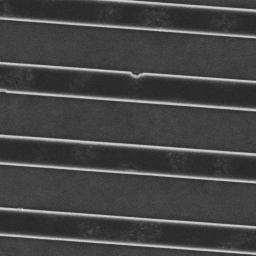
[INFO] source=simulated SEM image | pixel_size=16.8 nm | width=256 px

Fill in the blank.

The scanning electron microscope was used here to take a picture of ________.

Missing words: one or a few lines or trenches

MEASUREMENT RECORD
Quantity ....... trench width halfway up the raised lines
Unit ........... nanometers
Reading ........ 746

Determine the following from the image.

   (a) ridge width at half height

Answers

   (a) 478 nm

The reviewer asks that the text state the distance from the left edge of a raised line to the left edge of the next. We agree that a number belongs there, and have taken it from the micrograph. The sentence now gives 1210 nm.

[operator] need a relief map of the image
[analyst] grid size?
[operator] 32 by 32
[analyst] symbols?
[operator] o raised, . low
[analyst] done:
ooooooooooooooooooooo...........
oooooooooooooooooooooooooooooooo
...ooooooooooooooooooooooooooooo
.................ooooooooooooooo
..............................oo
................................
................................
................................
oooooooo........................
oooooooooooooooooooooo..........
oooooooooooooooooooooooooooooooo
.ooooooooooooooooooooooooooooooo
...............ooooooooooooooooo
............................oooo
................................
................................
................................
ooooooo.........................
ooooooooooooooooooooo...........
oooooooooooooooooooooooooooooooo
.ooooooooooooooooooooooooooooooo
..............oooooooooooooooooo
............................oooo
................................
................................
................................
ooooo...........................
ooooooooooooooooooo.............
oooooooooooooooooooooooooooooooo
...ooooooooooooooooooooooooooooo
...............ooooooooooooooooo
.............................ooo